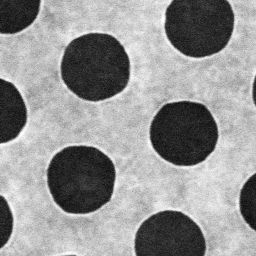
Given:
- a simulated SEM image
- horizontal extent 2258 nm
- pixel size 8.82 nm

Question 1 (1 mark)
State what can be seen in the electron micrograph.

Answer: holes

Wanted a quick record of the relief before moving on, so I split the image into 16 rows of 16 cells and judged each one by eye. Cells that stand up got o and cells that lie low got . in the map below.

..oooooooo.....o
..oooooooo.....o
ooooo..oooo...oo
oooo....oooo.ooo
oooo....oooooooo
.ooo....oooooooo
..oooooooo...ooo
..oooooooo...ooo
.oooooooo.....oo
oooo..oooo...ooo
ooo....ooooooooo
ooo....oooooooo.
ooo....oooooooo.
.oooooooo...ooo.
.oooooooo....ooo
oooooooo.....ooo